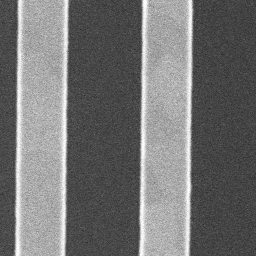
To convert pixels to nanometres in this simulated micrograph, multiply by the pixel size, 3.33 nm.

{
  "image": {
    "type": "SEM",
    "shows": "wiring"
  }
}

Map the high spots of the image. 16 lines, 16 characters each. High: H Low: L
LHHHLLLLLHHHLLLL
LHHHLLLLLHHHLLLL
LHHHLLLLLHHHLLLL
LHHHLLLLLHHHLLLL
LHHHLLLLLHHHLLLL
LHHHLLLLLHHHLLLL
LHHHLLLLLHHHLLLL
LHHHLLLLLHHHLLLL
LHHHLLLLLHHHLLLL
LHHHLLLLLHHHLLLL
LHHHLLLLLHHHLLLL
LHHHLLLLLHHHLLLL
LHHHLLLLLHHHLLLL
LHHHLLLLLHHHLLLL
LHHHLLLLLHHHLLLL
LHHHLLLLLHHHLLLL